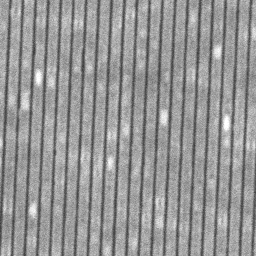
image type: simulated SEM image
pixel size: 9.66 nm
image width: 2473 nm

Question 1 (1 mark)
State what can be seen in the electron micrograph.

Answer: parallel lines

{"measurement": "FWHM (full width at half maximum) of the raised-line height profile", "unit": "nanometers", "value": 89.3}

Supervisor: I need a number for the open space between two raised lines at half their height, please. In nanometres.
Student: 35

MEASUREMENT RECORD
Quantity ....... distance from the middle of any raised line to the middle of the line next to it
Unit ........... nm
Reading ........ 122